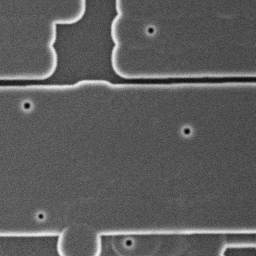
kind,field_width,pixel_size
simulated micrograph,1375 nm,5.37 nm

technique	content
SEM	wiring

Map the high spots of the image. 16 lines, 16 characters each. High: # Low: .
#####..#########
####...#########
###....#########
###....#########
###....#########
################
################
################
################
################
################
################
################
################
################
....##..........